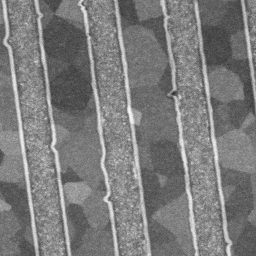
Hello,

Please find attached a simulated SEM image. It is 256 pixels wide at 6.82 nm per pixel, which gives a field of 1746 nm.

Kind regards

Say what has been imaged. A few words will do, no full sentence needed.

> one or a few lines or trenches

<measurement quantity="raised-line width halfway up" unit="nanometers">327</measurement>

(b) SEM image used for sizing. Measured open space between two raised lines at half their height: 214 nm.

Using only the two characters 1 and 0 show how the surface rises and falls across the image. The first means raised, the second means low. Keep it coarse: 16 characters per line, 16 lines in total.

0011100111001110
0011100111001110
0001110011100111
1001110011100111
1001110011100111
1001110011100111
1001110011100111
1001110011100111
1001110011100111
1001111011100111
1100110001110011
1100111001110011
1100111001110011
1100111001110011
1100111001110011
1100111001110011